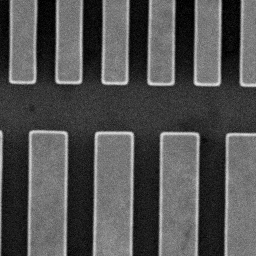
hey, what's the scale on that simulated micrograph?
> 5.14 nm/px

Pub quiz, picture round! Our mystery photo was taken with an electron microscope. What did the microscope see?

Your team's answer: groups of lines, slits or small figures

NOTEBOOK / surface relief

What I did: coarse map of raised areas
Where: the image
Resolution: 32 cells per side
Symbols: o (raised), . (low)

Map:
.oooo..ooo...ooo...ooo..oooo..oo
.oooo..ooo...ooo...ooo..oooo..oo
.oooo..ooo...ooo...ooo..oooo..oo
.oooo..ooo...ooo...ooo..oooo..oo
.oooo..ooo...ooo...ooo..oooo..oo
.ooo...ooo...ooo...ooo..oooo..oo
.ooo...ooo...ooo...ooo..oooo..oo
.ooo...ooo...ooo...ooo..oooo..oo
.ooo...ooo...ooo...ooo..oooo..oo
.ooo...ooo...ooo...ooo..oooo..oo
...................oo....oo...oo
................................
................................
................................
................................
................................
....oooo........................
....oooo....ooooo...ooooo...oooo
....oooo....ooooo...ooooo...oooo
....oooo....ooooo...ooooo...oooo
....oooo....ooooo...ooooo...oooo
....oooo....ooooo...ooooo...oooo
....oooo....oooo....ooooo...oooo
....oooo....oooo....ooooo...oooo
....oooo....oooo....ooooo...oooo
....oooo....oooo....ooooo...oooo
....oooo....oooo....ooooo...oooo
....oooo....oooo....ooooo...oooo
....oooo....oooo....ooooo...oooo
....oooo....oooo....ooooo...oooo
....oooo....oooo....ooooo...oooo
....oooo....oooo....ooooo...oooo